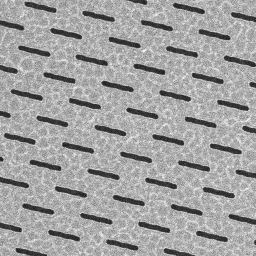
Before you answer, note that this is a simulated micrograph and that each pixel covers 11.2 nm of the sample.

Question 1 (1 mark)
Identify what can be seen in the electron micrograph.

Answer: a regular array of holes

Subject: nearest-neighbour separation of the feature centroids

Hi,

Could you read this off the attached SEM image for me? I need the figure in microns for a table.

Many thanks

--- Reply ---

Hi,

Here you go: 0.408